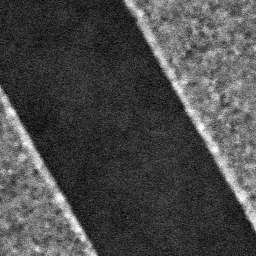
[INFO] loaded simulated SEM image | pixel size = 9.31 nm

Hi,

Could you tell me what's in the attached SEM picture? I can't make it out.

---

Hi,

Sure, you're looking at one or a few lines or trenches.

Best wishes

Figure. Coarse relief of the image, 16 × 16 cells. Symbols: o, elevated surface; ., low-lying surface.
........oooooooo
.........ooooooo
.........ooooooo
..........oooooo
...........ooooo
...........ooooo
............oooo
o...........oooo
o............ooo
oo...........ooo
ooo...........oo
ooo............o
oooo...........o
oooo............
ooooo...........
ooooo...........